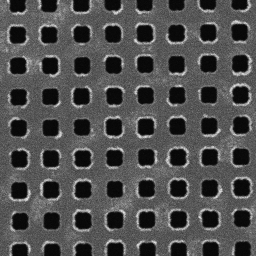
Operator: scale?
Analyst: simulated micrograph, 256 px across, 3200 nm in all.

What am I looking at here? a regular array of holes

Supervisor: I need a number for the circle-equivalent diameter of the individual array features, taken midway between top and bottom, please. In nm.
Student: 225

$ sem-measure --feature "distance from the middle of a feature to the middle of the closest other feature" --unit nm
386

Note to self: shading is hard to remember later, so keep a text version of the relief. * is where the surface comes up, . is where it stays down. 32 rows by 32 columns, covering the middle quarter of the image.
**.....***.....***....****....**
**.....***....****....****....**
********************************
********************************
********************************
********************************
***...*****...****....****....**
**.....***.....***....****....**
**.....***.....***....****....**
**....*****...*****...*****...**
********************************
********************************
********************************
****************************..**
***...*****...*****...****....**
***....***.....***....****.....*
***....***.....***.....***.....*
***...*****...*****...*****...**
********************************
********************************
********************************
*****.******..*****...*****...**
***....****....***.....***.....*
***....****....***.....***.....*
***....****....***.....***.....*
***...*****...*************...**
********************************
********************************
********************************
****..*****...*****...*****...**
***....****....****....****....*
***....****....****....****....*